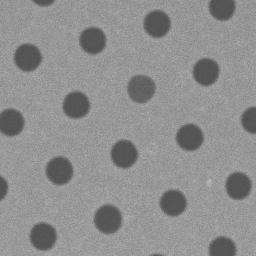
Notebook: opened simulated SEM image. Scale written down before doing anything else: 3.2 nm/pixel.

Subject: a regular array of holes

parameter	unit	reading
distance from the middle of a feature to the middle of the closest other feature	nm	214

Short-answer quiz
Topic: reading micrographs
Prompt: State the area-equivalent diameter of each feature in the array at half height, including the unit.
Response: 86.1 nanometers